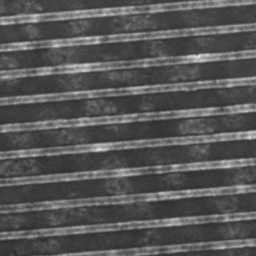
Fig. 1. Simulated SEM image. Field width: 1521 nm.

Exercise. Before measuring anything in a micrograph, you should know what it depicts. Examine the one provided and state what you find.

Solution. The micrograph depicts parallel lines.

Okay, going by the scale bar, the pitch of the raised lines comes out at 159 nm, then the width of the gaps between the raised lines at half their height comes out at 121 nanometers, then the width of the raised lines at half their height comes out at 39.9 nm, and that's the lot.